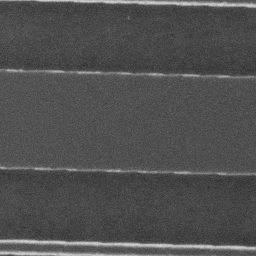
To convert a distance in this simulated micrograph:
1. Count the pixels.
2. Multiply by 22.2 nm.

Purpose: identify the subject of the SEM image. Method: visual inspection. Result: lines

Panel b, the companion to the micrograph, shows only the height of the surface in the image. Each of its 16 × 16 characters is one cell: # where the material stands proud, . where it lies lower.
................
................
................
................
####............
################
################
################
################
################
..##############
................
................
................
................
################